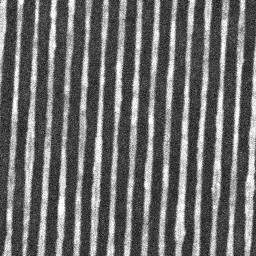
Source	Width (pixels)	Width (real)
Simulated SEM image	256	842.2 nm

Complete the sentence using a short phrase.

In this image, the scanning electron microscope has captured parallel lines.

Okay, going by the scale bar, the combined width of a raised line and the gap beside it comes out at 56.1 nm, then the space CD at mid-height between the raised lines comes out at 41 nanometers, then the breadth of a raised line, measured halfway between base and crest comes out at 15.6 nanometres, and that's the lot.